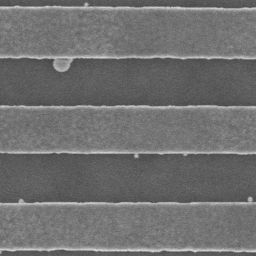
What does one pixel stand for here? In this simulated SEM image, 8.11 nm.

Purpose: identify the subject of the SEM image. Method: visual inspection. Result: lines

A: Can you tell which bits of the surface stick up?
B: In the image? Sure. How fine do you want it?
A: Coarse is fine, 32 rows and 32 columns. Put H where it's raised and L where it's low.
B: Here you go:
LLLLLLLLLLLLLLLLLLLLLLLLLLLLLLLL
HHHHHHHHHHHHHHHHHHHHHHHHHHHHHHHH
HHHHHHHHHHHHHHHHHHHHHHHHHHHHHHHH
HHHHHHHHHHHHHHHHHHHHHHHHHHHHHHHH
HHHHHHHHHHHHHHHHHHHHHHHHHHHHHHHH
HHHHHHHHHHHHHHHHHHHHHHHHHHHHHHHH
HHHHHHHHHHHHHHHHHHHHHHHHHHHHHHHH
LLLLLLLLLLLLLLLLLLLLLLLLLLLLLLLL
LLLLLLLLLLLLLLLLLLLLLLLLLLLLLLLL
LLLLLLLLLLLLLLLLLLLLLLLLLLLLLLLL
LLLLLLLLLLLLLLLLLLLLLLLLLLLLLLLL
LLLLLLLLLLLLLLLLLLLLLLLLLLLLLLLL
LLLLLLLLLLLLLLLLLLLLLLLLLLLLLLLL
HHHHHHHHHHHHHHHHHHHHHHHHHHHHHHHH
HHHHHHHHHHHHHHHHHHHHHHHHHHHHHHHH
HHHHHHHHHHHHHHHHHHHHHHHHHHHHHHHH
HHHHHHHHHHHHHHHHHHHHHHHHHHHHHHHH
HHHHHHHHHHHHHHHHHHHHHHHHHHHHHHHH
HHHHHHHHHHHHHHHHHHHHHHHHHHHHHHHH
LLLLLLLLLLLLLLLLLLLLLLLLLLLLLLLL
LLLLLLLLLLLLLLLLLLLLLLLLLLLLLLLL
LLLLLLLLLLLLLLLLLLLLLLLLLLLLLLLL
LLLLLLLLLLLLLLLLLLLLLLLLLLLLLLLL
LLLLLLLLLLLLLLLLLLLLLLLLLLLLLLLL
LLLLLLLLLLLLLLLLLLLLLLLLLLLLLLLL
HHHHHHHHHHHHHHHHHHHHHHHHHHHHHHHH
HHHHHHHHHHHHHHHHHHHHHHHHHHHHHHHH
HHHHHHHHHHHHHHHHHHHHHHHHHHHHHHHH
HHHHHHHHHHHHHHHHHHHHHHHHHHHHHHHH
HHHHHHHHHHHHHHHHHHHHHHHHHHHHHHHH
HHHHHHHHHHHHHHHHHHHHHHHHHHHHHHHH
LLLLLLLLLLLLLLLLLLLLLLLLLLLLLLLL